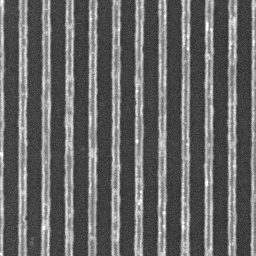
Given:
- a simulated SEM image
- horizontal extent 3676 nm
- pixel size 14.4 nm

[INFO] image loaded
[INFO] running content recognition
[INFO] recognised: parallel lines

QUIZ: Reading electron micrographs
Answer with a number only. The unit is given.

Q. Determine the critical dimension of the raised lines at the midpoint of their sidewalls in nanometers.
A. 93.4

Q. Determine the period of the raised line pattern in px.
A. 23.3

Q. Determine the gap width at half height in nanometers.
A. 241